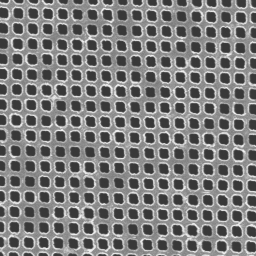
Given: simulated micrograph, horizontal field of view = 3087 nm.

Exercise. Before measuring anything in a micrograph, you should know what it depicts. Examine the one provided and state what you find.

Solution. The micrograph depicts a regular array of holes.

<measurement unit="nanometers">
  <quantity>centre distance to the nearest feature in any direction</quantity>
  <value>177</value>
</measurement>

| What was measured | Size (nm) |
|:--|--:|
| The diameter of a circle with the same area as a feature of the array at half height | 123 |